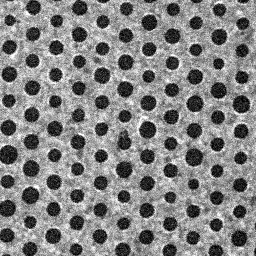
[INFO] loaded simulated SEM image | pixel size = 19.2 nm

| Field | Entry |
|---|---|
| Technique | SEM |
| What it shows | a regular array of holes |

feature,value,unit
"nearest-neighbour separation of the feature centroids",26.7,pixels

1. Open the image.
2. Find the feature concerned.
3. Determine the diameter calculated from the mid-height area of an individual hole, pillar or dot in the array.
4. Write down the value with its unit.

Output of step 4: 292 nm